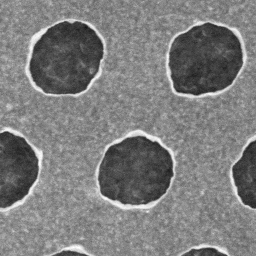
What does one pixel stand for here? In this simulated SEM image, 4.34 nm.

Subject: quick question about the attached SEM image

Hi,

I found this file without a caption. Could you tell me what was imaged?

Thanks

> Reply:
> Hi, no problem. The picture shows holes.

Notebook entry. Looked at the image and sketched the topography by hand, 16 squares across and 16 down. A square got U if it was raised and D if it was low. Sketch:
UUUUUUUUUUUUUUUU
UUUUDUUUUUUUUUUU
UUDDDDUUUUUDDDDU
UUDDDDUUUUUDDDDU
UUDDDDUUUUUDDDDU
UUDDDUUUUUUDDDUU
UUUUUUUUUUUUUUUU
UUUUUUUUUUUUUUUU
DUUUUUUUDUUUUUUU
DDUUUUUDDDDUUUUD
DDUUUUDDDDDUUUUD
DDUUUUDDDDDUUUUD
DUUUUUUDDDUUUUUD
UUUUUUUUUUUUUUUU
UUUUUUUUUUUUUUUU
UUUUUUUUUUUUUUUU